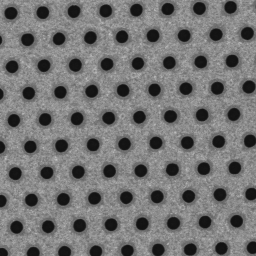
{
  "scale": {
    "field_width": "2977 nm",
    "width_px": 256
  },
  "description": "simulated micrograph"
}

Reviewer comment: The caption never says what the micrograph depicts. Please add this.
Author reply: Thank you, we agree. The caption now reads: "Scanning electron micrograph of a regular array of holes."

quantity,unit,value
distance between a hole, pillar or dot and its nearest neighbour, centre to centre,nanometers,358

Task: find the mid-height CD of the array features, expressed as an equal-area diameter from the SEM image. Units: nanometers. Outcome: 148